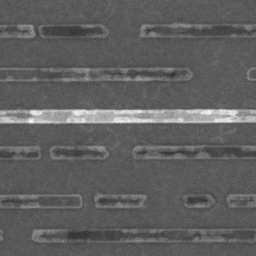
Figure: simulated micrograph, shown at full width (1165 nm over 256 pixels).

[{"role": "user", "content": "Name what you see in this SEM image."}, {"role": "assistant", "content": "parallel lines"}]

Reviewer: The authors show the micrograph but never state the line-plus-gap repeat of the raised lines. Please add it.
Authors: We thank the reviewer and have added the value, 0.188 micrometres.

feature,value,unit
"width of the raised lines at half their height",0.0569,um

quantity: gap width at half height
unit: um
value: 0.134